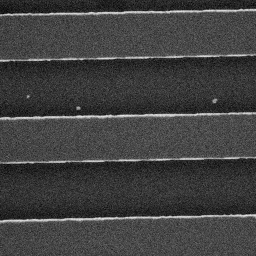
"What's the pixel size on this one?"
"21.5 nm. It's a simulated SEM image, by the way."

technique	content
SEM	lines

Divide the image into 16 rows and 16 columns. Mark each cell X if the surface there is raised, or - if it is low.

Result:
----------------
XXXXXXXXXXXXXXXX
XXXXXXXXXXXXXXXX
XXXXXXXXXXXXXX--
----------------
----------------
----------------
XXXXXXXXXXXXXXXX
XXXXXXXXXXXXXXXX
XXXXXXXXXXXXXXXX
----------------
----------------
----------------
------------XXXX
XXXXXXXXXXXXXXXX
XXXXXXXXXXXXXXXX